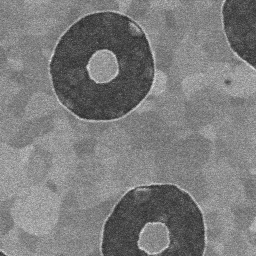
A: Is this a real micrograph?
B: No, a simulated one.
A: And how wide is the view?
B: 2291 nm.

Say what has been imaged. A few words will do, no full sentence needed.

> ring-shaped grooves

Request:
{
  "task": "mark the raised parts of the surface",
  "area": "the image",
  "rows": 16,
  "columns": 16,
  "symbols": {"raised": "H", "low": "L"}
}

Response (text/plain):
HHHHHHHHHHHHHHLL
HHHHHLLLHHHHHHLL
HHHHLLLLLHHHHHLL
HHHLLLHLLLHHHHHL
HHHLLLHLLHHHHHHH
HHHLLLLLLHHHHHHH
HHHHLLLLLHHHHHHH
HHHHHHLHHHHHHHHH
HHHHHHHHHHHHHHHH
HHHHHHHHHHHHHHHH
HHHHHHHHHHHHHHHH
HHHHHHHHHHHHHHHH
HHHHHHHHLLLLHHHH
HHHHHHHLLLLLLHHH
HHHHHHLLLHLLLHHH
HHHHHHLLLHLLLHHH